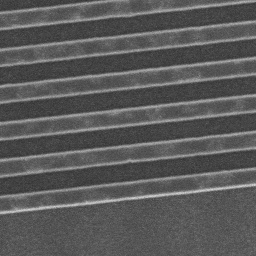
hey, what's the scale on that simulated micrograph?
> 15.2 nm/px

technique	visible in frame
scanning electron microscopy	parallel lines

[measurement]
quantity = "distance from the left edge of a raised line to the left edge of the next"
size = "554 nanometres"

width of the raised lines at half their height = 0.26 micrometres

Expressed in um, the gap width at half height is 0.298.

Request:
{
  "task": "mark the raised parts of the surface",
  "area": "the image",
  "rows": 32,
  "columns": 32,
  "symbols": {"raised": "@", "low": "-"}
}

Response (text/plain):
----------@@@@@@@@@@@@@@@@@@@---
-@@@@@@@@@@@@@@@@@@@------------
@@@@@@@@@@@---------------------
@@----------------------@@@@@@@@
---------------@@@@@@@@@@@@@@@@@
------@@@@@@@@@@@@@@@@@@@-------
@@@@@@@@@@@@@@@@----------------
@@@@@@@----------------------@@@
---------------------@@@@@@@@@@@
------------@@@@@@@@@@@@@@@@@@--
---@@@@@@@@@@@@@@@@@@-----------
@@@@@@@@@@@@--------------------
@@@-----------------------@@@@@@
------------------@@@@@@@@@@@@@@
--------@@@@@@@@@@@@@@@@@@@-----
@@@@@@@@@@@@@@@@@@--------------
@@@@@@@@@----------------------@
----------------------@@@@@@@@@@
-------------@@@@@@@@@@@@@@@@@@@
----@@@@@@@@@@@@@@@@@@@---------
@@@@@@@@@@@@@@------------------
@@@@@-----------------------@@@@
-------------------@@@@@@@@@@@@@
----------@@@@@@@@@@@@@@@@@@----
-@@@@@@@@@@@@@@@@@@-------------
@@@@@@@@@@----------------------
@-------------------------------
--------------------------------
--------------------------------
--------------------------------
--------------------------------
--------------------------------